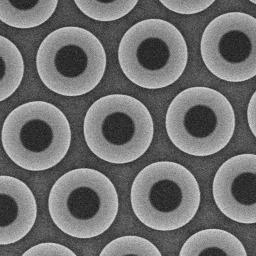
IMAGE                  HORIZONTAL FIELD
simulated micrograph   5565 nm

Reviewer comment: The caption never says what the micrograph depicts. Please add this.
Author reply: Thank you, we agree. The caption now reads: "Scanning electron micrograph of an array of small figures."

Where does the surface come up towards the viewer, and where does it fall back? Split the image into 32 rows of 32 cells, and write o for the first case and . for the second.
ooooooo...ooooooo...oooooo......
ooooooo...oooooo......ooo.......
oooooo......oo....oo.......ooooo
........oo......oooooo....oooooo
......oooooo...oooooooo..ooooooo
oo...oooooooo..oooooooo..ooooooo
oo...oooooooo..oooooooo..ooooooo
ooo..oooooooo..oooooooo..ooooooo
ooo..oooooooo..oooooooo...oooooo
ooo..oooooooo...oooooo.....ooooo
oo....oooooo.....oooo...........
oo.....oooo............oooo.....
............ooooo.....oooooo...o
..ooooo....ooooooo...oooooooo..o
.ooooooo...oooooooo..oooooooo..o
ooooooooo..oooooooo..oooooooo..o
ooooooooo..oooooooo..oooooooo...
ooooooooo..oooooooo..oooooooo...
.oooooooo..ooooooo....oooooo....
.ooooooo....ooooo.............oo
..ooooo............ooo......oooo
.........ooo......oooooo...ooooo
oo.....ooooooo...ooooooo...ooooo
oooo...ooooooo...oooooooo..ooooo
oooo..ooooooooo.ooooooooo..ooooo
oooo..ooooooooo.ooooooooo..ooooo
ooooo.ooooooooo..ooooooo....oooo
oooo...ooooooo....oooooo.....ooo
oooo...oooooo......ooo..........
ooo......ooo............ooooo...
.....oo.......ooooo....ooooooo..
...oooooo....ooooooo...oooooooo.